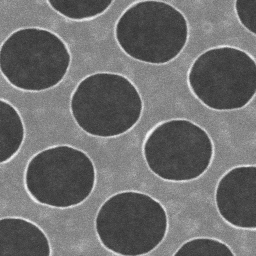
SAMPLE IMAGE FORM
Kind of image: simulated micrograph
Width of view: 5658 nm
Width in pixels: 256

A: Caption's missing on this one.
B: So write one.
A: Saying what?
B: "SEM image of holes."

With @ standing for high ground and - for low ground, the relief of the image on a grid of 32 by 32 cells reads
@@@@@@--------@@@----@@@@@@@@---
@@@@@@@------@@@------@@@@@@@@--
@@@@@@@@@@@@@@@--------@@@@@@@--
@@@@-@@@@@@@@@---------@@@@@@@@-
@------@@@@@@@---------@@@@@@@@@
--------@@@@@@@--------@@@@@@@@@
---------@@@@@@@------@@@@----@@
---------@@@@@@@@----@@@@-------
--------@@@@@@@@@@@@@@@@--------
@-------@@@----@@@@@@@@@--------
@@-----@@@-------@@@@@@@--------
@@@@@@@@@--------@@@@@@@--------
@@@@@@@@@---------@@@@@@@------@
--@@@@@@@---------@@@@@@@@----@@
--@@@@@@@---------@@@@@@@@@@@@@@
---@@@@@@@-------@@@----@@@@@@@@
---@@@@@@@@-----@@@-------@@@@@@
---@@@@@@@@@@@@@@@--------@@@@@@
--@@@@@--@@@@@@@@@---------@@@@@
-@@@-------@@@@@@@--------@@@@@@
@@@@--------@@@@@@--------@@@@@@
@@@---------@@@@@@@------@@@----
@@@---------@@@@@@@@@---@@@@----
@@@---------@@@@@@@@@@@@@@@-----
@@@@-------@@@-----@@@@@@@@-----
@@@@@@----@@@-------@@@@@@@-----
@@@@@@@@@@@@---------@@@@@@-----
---@@@@@@@@@---------@@@@@@@----
-----@@@@@@@---------@@@@@@@@@@-
------@@@@@@---------@@@@@@@@@@@
------@@@@@@@-------@@@-----@@@@
------@@@@@@@@-----@@@-------@@@